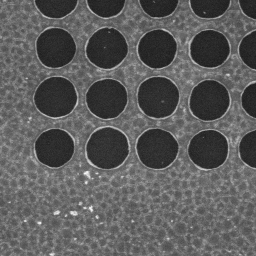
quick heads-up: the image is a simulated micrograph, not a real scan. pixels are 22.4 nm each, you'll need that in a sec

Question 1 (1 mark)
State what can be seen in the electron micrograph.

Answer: a regular array of holes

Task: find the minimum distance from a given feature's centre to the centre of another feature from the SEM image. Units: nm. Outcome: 1110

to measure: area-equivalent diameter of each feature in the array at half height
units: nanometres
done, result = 918